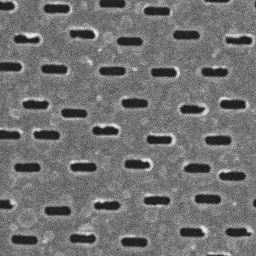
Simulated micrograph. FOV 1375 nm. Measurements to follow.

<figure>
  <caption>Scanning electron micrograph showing a regular array of holes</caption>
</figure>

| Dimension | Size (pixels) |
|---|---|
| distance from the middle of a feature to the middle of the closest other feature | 37.3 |